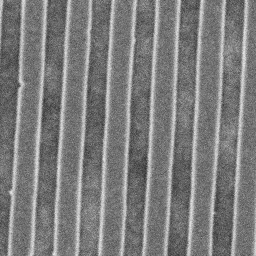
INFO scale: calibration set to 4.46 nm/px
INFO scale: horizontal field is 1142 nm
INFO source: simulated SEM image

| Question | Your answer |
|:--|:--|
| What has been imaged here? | parallel lines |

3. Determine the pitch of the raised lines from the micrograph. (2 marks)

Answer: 0.199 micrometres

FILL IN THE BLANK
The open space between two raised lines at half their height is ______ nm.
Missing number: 90.1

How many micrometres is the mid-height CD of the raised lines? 0.11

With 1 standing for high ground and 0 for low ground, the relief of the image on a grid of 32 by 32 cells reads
00011100111000111001111001110001
00011100111000111001110001110001
00011100111000111001110001110001
00011100111000111001110001110001
00011100111000111001110001110001
00011100111000111001110001110011
00011000111000111001110001110011
00011100111000111001110001110011
00111000111000110001110001110011
00111000111001110001110001110011
00011000111001110001110001110011
00111000111001110001110001110011
00111000111001110001110011110011
00111000111001110001110011110011
00111000111001110001110011100011
00111000111001110001110011100011
00111000111001110001110011100011
00111001110001110001110011100011
00111001110001110001110011100011
00111001110001110001110011100011
00111001110001110001110011100011
00111001110001110011100011100011
00111001110001110011100011100111
01111001110001110011100011100111
01111001110001110011100011100111
01110001110001110011100011100111
01110001110001110011100011100111
01110001110001110011100011100111
01110001110001110011100011100111
01110001110001110011100011000111
01110001110011100011100011100111
01110001110011100011100111000111